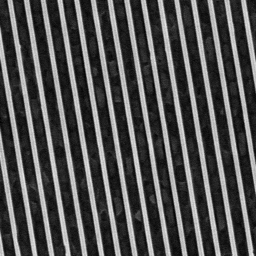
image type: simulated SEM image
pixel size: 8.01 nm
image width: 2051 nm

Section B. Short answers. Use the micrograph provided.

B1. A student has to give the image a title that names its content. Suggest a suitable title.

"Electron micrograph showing parallel lines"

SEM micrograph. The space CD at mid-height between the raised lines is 99.8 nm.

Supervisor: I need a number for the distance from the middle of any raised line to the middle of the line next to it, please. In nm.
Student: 132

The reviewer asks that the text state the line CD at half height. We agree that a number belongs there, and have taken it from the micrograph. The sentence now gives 35.6 nanometers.